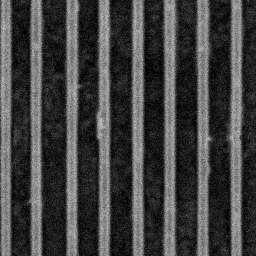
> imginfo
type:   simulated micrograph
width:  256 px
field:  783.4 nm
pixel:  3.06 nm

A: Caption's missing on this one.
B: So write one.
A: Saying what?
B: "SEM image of parallel lines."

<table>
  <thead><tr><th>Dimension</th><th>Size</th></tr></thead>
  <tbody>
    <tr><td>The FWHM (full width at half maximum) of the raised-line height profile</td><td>24.5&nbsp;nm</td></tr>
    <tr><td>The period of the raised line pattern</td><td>101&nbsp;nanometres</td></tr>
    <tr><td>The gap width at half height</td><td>76.5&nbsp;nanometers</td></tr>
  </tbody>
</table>